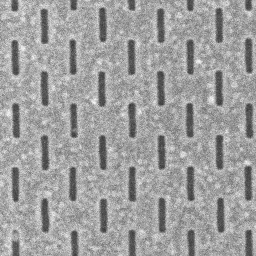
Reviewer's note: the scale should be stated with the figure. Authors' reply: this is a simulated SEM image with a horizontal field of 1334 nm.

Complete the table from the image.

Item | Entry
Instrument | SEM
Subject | a regular array of holes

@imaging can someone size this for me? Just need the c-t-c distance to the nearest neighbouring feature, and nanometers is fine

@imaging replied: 222